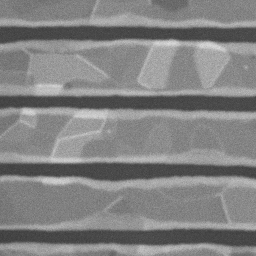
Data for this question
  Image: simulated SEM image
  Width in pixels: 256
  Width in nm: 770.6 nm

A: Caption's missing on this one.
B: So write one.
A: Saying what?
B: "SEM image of lines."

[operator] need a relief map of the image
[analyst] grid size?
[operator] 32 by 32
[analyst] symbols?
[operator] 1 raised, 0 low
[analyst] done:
11111111111111111111111111111111
11111111111111111111111111111111
11111111111111111111111111111111
00000000000000000000000000000000
00000000000000000000000000000000
00111111111111111111111111100000
11111111111111111111111111111111
11111111111111111111111111111111
11111111111111111111111111111111
11111111111111111111111111111111
11111111111111111111111111111111
11111111111111111111111111111111
00000000000000000000000000000000
00000000000000000000000000000000
11111111111111111111111111111111
11111111111111111111111111111111
11111111111111111111111111111111
11111111111111111111111111111111
11111111111111111111111111111111
11111111111111111111111111111111
00000000000000000000000000000001
00000000000000000000000000000000
11111111111000000000011111111110
11111111111111111111111111111111
11111111111111111111111111111111
11111111111111111111111111111111
11111111111111111111111111111111
11111111111111111111111111111111
11111111000000000000000000001111
00000000000000000000000000000000
00000000000000000000000000000000
11111111111111111111111111111111